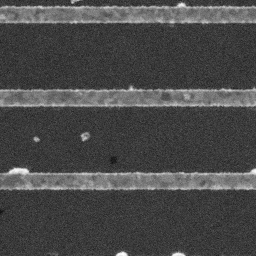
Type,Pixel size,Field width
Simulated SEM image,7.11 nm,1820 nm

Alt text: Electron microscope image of lines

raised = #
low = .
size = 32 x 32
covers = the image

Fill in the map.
................................
################################
################################
................................
................................
................................
................................
................................
................................
................................
................................
################################
################################
................................
................................
................................
................................
................................
................................
................................
................................
..#.............................
################################
#################.##.###..######
................................
................................
................................
................................
................................
................................
................................
................................